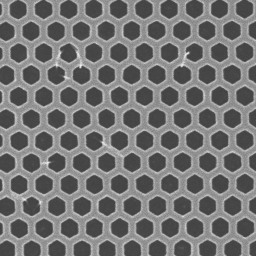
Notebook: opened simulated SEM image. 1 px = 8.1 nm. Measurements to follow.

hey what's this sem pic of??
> a regular array of holes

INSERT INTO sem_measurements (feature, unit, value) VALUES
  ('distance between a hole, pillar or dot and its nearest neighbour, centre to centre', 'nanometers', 201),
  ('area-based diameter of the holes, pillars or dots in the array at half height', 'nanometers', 147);